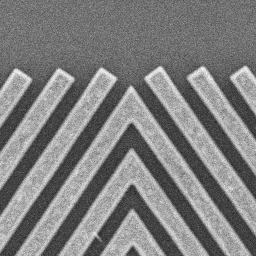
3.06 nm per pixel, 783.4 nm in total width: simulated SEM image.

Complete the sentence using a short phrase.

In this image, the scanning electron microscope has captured groups of lines, slits or small figures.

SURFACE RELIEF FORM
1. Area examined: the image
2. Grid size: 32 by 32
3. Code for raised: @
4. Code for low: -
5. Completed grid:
--------------------------------
--------------------------------
--------------------------------
--------------------------------
--------------------------------
--------------------------------
--------------------------------
--------------------------------
--------------------------------
-@@----@@---@@-----@@---@@---@@-
-@@@--@@@--@@@-----@@---@@@--@@@
@@@--@@@---@@---@--@@@---@@@--@@
@@---@@---@@@--@@---@@@--@@@---@
@@--@@@--@@@---@@@---@@@--@@@---
@--@@@---@@---@@@@@---@@---@@@--
---@@---@@@--@@@-@@@--@@@---@@--
--@@@--@@@---@@---@@---@@@--@@@-
-@@@---@@---@@@---@@@---@@---@@@
-@@---@@@--@@@-----@@@--@@@---@@
@@@--@@@---@@---@---@@---@@@--@@
@@---@@---@@@--@@@--@@@---@@@--@
@---@@@--@@@---@@@---@@@--@@@---
@--@@@---@@---@@@@@---@@@--@@@--
---@@---@@@--@@@-@@@---@@---@@@-
--@@@--@@@--@@@---@@@--@@@---@@-
-@@@--@@@---@@-----@@---@@@--@@@
-@@---@@---@@@-----@@@---@@---@@
@@@--@@@--@@@---@---@@@--@@@---@
@@--@@@---@@---@@@---@@---@@@--@
@---@@---@@@--@@@@@--@@@---@@@--
@--@@@--@@@---@@@@@---@@@--@@@--
--@@@---@@---@@@-@@@---@@@--@@@-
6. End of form